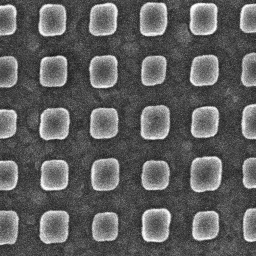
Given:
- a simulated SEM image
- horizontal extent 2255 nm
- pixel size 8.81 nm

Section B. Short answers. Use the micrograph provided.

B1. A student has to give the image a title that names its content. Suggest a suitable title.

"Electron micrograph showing a regular array of raised bodies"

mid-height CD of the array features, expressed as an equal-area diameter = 0.273 microns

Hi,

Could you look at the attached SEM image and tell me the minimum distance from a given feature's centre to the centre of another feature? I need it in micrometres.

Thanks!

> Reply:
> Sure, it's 0.44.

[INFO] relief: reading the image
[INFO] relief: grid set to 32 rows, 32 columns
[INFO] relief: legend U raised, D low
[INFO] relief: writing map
DDDDDDDDDDDDDUDDDDUUDDDDDUUDDDDD
UUDDDUUUDDDUUUUDDDUUUDDDUUUDDDUU
UUDDDUUUDDDUUUUDDDUUUDDDUUUDDDUU
UUDDDUUUDDDUUUDDDDUUUDDDUUUDDDUU
DDDDDDDDDDDDDDDDDDDDDDDDDDDDDDDD
DDDDDDDDDDDDDDDDDDDDDDDDDDDDDDDD
DDDDDDDDDDDDDDDDDDDDDDDDDDDDDDDD
UUDDDUUUDDDDUUDDDDUUUDDDUUUDDDUU
UUDDDUUUDDDUUUUDDDUUUDDDUUUDDDUU
UUDDDUUUDDDUUUUDDDUUUDDDUUUDDDUU
UUDDDUUUDDDDUUDDDDUUDDDDUUDDDDDU
DDDDDDDDDDDDDDDDDDDDDDDDDDDDDDDD
DDDDDDDDDDDDDDDDDDDDDDDDDDDDDDDD
DDDDDDDDDDDDDDDDDDUUUDDDDUUDDDDU
UUDDDUUUUDDUUUUDDDUUUDDDUUUDDDUU
UUDDDUUUUDDUUUUDDDUUUDDDUUUDDDUU
UUDDDUUUDDDUUUUDDDUUUDDDUUUDDDUU
DDDDDDDDDDDDDDDDDDDDDDDDDDDDDDDD
DDDDDDDDDDDDDDDDDDDDDDDDDDDDDDDD
DDDDDDDDDDDDDDDDDDDDDDDDDDDDDDDD
UUDDDUUUDDDDUUUDDDUUUDDDUUUUDDUU
UUDDDUUUUDDDUUUDDDUUUDDDUUUUDDUU
UUDDDUUUDDDDUUUDDDUUUDDDUUUDDDDU
UUDDDDUUDDDDUUDDDDUUDDDDUUUDDDDD
DDDDDDDDDDDDDDDDDDDDDDDDDDDDDDDD
DDDDDDDDDDDDDDDDDDDDDDDDDDDDDDDD
UUDDDDUUDDDDDDDDDDUUUDDDDUUDDDDU
UUDDDUUUUDDDUUUDDDUUUDDDUUUDDDDU
UUDDDUUUDDDDUUUDDDUUUDDDUUUDDDUU
UUDDDUUUDDDDUUUDDDUUUDDDUUUDDDDU
UDDDDDDDDDDDDDDDDDDDDDDDDDDDDDDD
DDDDDDDDDDDDDDDDDDDDDDDDDDDDDDDD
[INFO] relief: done